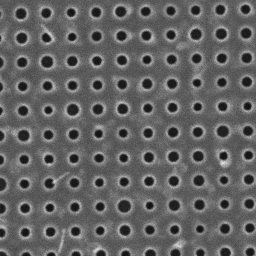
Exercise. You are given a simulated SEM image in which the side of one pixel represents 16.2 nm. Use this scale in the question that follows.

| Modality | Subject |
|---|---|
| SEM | a regular array of holes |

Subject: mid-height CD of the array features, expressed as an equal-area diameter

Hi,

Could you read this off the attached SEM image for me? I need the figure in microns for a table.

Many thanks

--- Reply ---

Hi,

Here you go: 0.164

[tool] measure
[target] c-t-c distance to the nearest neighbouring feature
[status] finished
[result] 0.391 micrometres